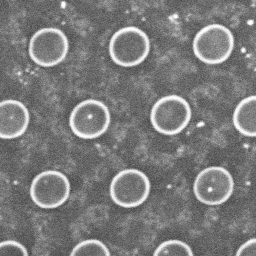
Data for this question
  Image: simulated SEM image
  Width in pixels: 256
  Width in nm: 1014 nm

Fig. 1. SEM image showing a regular array of raised bodies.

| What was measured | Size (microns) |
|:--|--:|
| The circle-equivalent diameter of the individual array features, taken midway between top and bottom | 0.148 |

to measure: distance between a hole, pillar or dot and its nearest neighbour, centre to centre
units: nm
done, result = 317